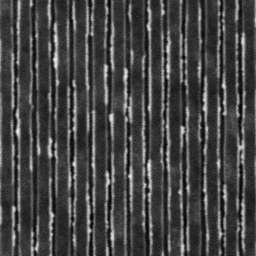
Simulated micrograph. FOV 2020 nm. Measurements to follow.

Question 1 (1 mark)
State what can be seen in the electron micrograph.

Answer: parallel lines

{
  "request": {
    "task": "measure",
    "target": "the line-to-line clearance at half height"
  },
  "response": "4.37 px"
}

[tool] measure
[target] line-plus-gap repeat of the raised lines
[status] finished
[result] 148 nm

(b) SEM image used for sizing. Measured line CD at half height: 0.111 microns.